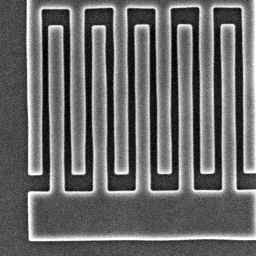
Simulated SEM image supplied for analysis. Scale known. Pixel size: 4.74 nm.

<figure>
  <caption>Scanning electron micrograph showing groups of lines, slits or small figures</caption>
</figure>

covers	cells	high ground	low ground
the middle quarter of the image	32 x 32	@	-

--@@@--@@@---@@@--@@@--@@@@--@@@
--@@@--@@@---@@@--@@@--@@@@--@@@
--@@@--@@@---@@@--@@@--@@@@--@@@
--@@@--@@@---@@@--@@@--@@@@--@@@
--@@@--@@@---@@@--@@@--@@@@--@@@
--@@@--@@@---@@@--@@@--@@@@--@@@
--@@@--@@@---@@@--@@@--@@@---@@@
--@@@--@@@@--@@@--@@@--@@@---@@@
--@@@--@@@@--@@@--@@@---@@---@@@
--@@@--@@@@--@@@--@@@---@@---@@@
--@@@--@@@@--@@@--@@@---@@---@@@
--@@@--@@@@--@@@--@@@---@@---@@@
--@@@--@@@@--@@@--@@@---@@---@@@
--@@@--@@@@--@@@--@@@---@@---@@@
--@@@--@@@@--@@@--@@@---@@---@@@
--@@@--@@@@--@@@--@@@---@@---@@@
--@@@--@@@@--@@@--@@@---@@@--@@@
--@@@--@@@@--@@@--@@@---@@@--@@@
--@@@--@@@@--@@@--@@@---@@@--@@@
--@@@--@@@@--@@@--@@@---@@@--@@@
--@@@--@@@@--@@@--@@@---@@@--@@@
--@@@--@@@---@@@--@@@---@@@--@@@
--@@@--@@@---@@@--@@@---@@@--@@@
--@@@--@@@---@@@--@@@---@@@--@@@
--@@@--@@@@--@@@--@@@---@@@--@@@
--@@@--@@@@--@@@--@@@---@@@--@@@
--@@@--@@@@--@@@--@@@---@@@--@@@
-------@@@@-------@@@--------@@@
-------@@@@-------@@@--------@@@
-------@@@@-------@@@--------@@@
-------@@@@-------@@@--------@@@
-------@@@@-------@@@@------@@@@